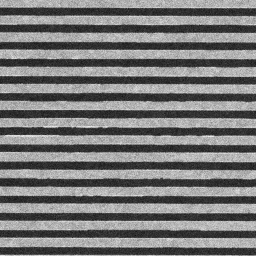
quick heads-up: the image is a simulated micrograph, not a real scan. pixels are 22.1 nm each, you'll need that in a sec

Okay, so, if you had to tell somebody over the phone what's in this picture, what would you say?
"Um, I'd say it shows parallel lines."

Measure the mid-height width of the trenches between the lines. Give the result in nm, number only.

194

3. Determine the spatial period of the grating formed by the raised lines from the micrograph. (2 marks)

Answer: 0.379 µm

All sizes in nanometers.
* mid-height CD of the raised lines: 186